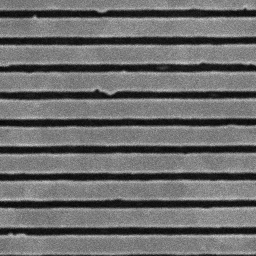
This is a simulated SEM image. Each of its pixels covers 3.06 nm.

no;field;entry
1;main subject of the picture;parallel lines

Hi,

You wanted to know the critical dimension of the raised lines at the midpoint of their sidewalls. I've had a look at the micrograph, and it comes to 0.0578 microns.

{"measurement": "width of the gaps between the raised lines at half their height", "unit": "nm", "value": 24.5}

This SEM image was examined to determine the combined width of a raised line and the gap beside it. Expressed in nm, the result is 83.3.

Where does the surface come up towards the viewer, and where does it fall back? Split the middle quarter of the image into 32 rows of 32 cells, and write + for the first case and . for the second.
................................
................................
++++++++++++++++++++++++++++++++
++++++++++++++++++++++++++++++++
++++++++++++++++++++++++++++++++
++++++++++++++++++++++++++++++++
++++++++.+++++++++++++++++++++++
...........+....................
................................
++++++++++++++++++++++++++++++++
++++++++++++++++++++++++++++++++
++++++++++++++++++++++++++++++++
++++++++++++++++++++++++++++++++
++++++++++++++++................
................................
................................
++++++++++++++++++++++++++++++++
++++++++++++++++++++++++++++++++
++++++++++++++++++++++++++++++++
++++++++++++++++++++++++++++++++
................................
................................
+++..+.+....+++.+++++++......+..
++++++++++++++++++++++++++++++++
++++++++++++++++++++++++++++++++
++++++++++++++++++++++++++++++++
++++++++++++++++++++++++++++++++
................................
................................
++++++++++++++++++++++++++++++++
++++++++++++++++++++++++++++++++
++++++++++++++++++++++++++++++++